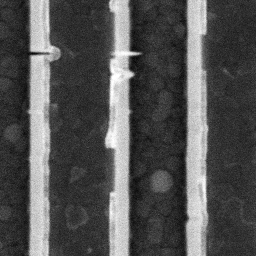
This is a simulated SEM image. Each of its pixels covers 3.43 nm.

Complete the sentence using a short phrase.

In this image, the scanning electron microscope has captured one or a few lines or trenches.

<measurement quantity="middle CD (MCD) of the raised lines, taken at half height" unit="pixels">84.4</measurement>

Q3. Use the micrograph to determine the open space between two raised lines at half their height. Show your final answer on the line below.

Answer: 250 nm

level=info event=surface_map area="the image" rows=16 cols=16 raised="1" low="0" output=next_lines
0011111100001111
0011111100001111
0011111100001111
0011111100001111
0011111100001111
0011111100001111
0011111100001111
0011111100001111
0011111100001111
0011111100001111
0011111100001111
0011111100001111
0011111100001111
0011111100001111
0011111100001111
0011111100001111